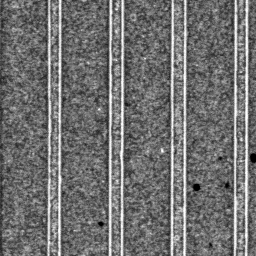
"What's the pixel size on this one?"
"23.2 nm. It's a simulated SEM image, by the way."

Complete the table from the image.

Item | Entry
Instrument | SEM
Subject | one or a few lines or trenches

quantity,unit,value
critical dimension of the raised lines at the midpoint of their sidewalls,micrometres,0.264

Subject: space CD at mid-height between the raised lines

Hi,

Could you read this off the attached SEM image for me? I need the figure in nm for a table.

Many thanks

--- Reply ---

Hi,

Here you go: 1170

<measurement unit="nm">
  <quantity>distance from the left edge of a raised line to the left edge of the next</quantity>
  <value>1440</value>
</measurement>